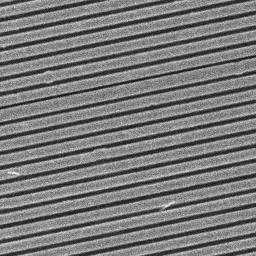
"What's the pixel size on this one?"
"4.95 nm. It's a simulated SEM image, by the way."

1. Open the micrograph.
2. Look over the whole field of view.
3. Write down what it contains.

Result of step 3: parallel lines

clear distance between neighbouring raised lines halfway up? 21.9 nanometers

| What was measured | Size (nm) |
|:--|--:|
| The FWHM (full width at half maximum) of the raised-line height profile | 48.5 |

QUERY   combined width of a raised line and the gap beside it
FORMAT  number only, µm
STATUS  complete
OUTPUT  0.0718